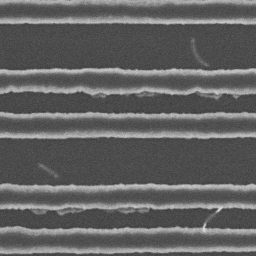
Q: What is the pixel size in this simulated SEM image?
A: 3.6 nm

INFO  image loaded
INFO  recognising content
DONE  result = lines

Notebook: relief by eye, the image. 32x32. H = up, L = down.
HHHHHHHHHHHHHHHHHHHHHHHHHHHHHHHH
HHHHHHHHHHHHHHHHHHHHHHHHHHHHHHHH
HHHHHHHHHHHHHHHHHHHHHHHHHHHHHHHH
LLLLLLLLLLLLLLLLLLLLLLLLLLLLLLLL
LLLLLLLLLLLLLLLLLLLLLLLLLLLLLLLL
LLLLLLLLLLLLLLLLLLLLLLLLLLLLLLLL
LLLLLLLLLLLLLLLLLLLLLLLLLLLLLLLL
LLLLLLLLLLLLLLLLLLLLLLLLLLLLLLLL
LLLLLLLLLLLLLLLLLLLLLLLLLLLLLLLL
HHHHHHHHHHHHHHHHHHHHHHHHHHHHHHHH
HHHHHHHHHHHHHHHHHHHHHHHHHHHHHHHH
LLLLLLLLHLLHHHHHLLLLLHHHLLHHHHHL
LLLLLLLLLLLLLLLLLLLLLLLLLLLLLLLL
LLLLLLLLLLLLLLLLLLLLLLLLLLLLLLLL
HHHHHHHHHHHHHHHHHHHHHHHHHHHHHHHH
HHHHHHHHHHHHHHHHHHHHHHHHHHHHHHHH
HHHHHHHHHHHHHHHHHHHHHHHHHHHHHHHH
LLLLLLLLLLLLLLLLLLLLLLLLLLLLLLLL
LLLLLLLLLLLLLLLLLLLLLLLLLLLLLLLL
LLLLLLLLLLLLLLLLLLLLLLLLLLLLLLLL
LLLLLLLLLLLLLLLLLLLLLLLLLLLLLLLL
LLLLLLLLLLLLLLLLLLLLLLLLLLLLLLLL
LLLLLLLLLLLLLLLLLLLLLLLLLLLLLLLL
HHHHHHHHHHHHHHHHHHHHHHHHHHHHHHHH
HHHHHHHHHHHHHHHHHHHHHHHHHHHHHHHH
HHHHHHHHHHHHHHHHHHHHHHHHHHHHHHHH
LLLLLLLLLLLLLLLLLLLLLLLLLLLLLLLL
LLLLLLLLLLLLLLLLLLLLLLLLLLLLLLLL
LHHLLLLLLLLLLLLLLLLLLLLLLLLLLLLL
HHHHHHHHHHHHHHHHHHHHHHHHHHHHHHHH
HHHHHHHHHHHHHHHHHHHHHHHHHHHHHHHH
HLLLLLLLLHHLLLLLLLLLLLLLLLLLLLLL